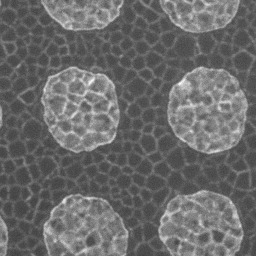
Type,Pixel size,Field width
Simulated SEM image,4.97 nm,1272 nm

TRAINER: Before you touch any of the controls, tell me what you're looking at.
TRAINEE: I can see raised bodies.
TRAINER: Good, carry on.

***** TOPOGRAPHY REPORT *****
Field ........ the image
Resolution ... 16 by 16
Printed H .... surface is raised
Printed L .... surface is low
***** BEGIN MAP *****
LLLHHHHLLLHHHHHL
LLLLHHHLLLLHHHLL
LLLLLLLLLLLLLLLL
LLLLLLLLLLLLLLLL
LLLLHLLLLLLLHHLL
LLLHHHHLLLLHHHHL
LLLHHHHLLLLHHHHL
LLLHHHHLLLLHHHHL
LLLHHHHLLLLHHHHL
LLLLLLLLLLLLLHLL
LLLLLLLLLLLLLLLL
LLLLLLLLLLLLLLLL
LLLLHHLLLLLHHHLL
LLLHHHHLLLHHHHHL
LLLHHHHHLLHHHHHL
LLLHHHHHLLHHHHHL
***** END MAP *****